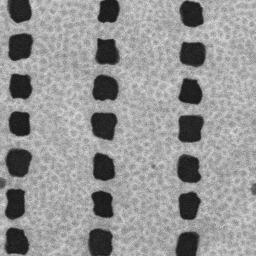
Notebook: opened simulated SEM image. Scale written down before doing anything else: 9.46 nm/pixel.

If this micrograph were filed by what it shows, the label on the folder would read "a regular array of holes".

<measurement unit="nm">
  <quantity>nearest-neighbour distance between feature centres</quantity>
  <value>346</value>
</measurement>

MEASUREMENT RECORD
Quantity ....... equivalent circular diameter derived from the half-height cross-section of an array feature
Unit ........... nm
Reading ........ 242